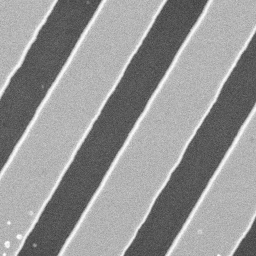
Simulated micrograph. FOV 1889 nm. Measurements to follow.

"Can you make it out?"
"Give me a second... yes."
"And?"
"lines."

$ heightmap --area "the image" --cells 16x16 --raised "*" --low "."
***...****...***
***...****..****
**...****...****
**..****...****.
*...****..****..
...****...****..
...****..****...
..****...****..*
.****...****...*
.****..*****..**
****...****...**
****..****...***
***...****..****
**...****...****
**...****..****.
*...****...****.